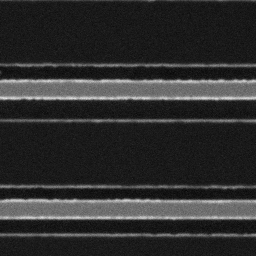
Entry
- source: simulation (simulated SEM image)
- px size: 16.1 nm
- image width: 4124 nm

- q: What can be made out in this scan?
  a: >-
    lines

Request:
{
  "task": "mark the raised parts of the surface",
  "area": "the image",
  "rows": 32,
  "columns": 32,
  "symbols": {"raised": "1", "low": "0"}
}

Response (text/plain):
11111111111111111111111111111111
11111111111111111111111111111111
11111111111111111111111111111111
11111111111111111111111111111111
11111111111111111111111111111111
11111111111111111111111111111111
11111111111111111111111111111111
11111111111111111111111111111111
00000000000000000000000000000000
00000000000000000000000000000000
11111111111111111111111111111111
11111111111111111111111111111111
00000000000000000000000000000000
00000000000000000000000000000000
00000000000000000000000000000000
11111111111111111111111111111111
11111111111111111111111111111111
11111111111111111111111111111111
11111111111111111111111111111111
11111111111111111111111111111111
11111111111111111111111111111111
11111111111111111111111111111111
11111111111111111111111111111111
00000000000000000000000001011100
00000000000000000000000000000000
11111111111111111111111111111111
11111111111111111111111111111111
00000000000000000000000000000000
00000000000000000000000000000000
11111111111111111111111111111111
11111111111111111111111111111111
11111111111111111111111111111111